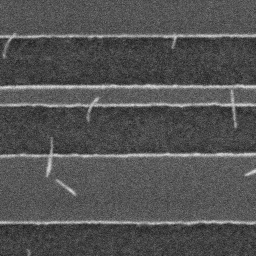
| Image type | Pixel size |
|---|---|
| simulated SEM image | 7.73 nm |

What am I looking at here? lines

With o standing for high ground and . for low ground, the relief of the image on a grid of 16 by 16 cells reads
oooooooooooooooo
oooooooooooooooo
................
................
................
oooooooooooooooo
oooooooooooooooo
................
................
................
oooooooooooooooo
oooooooooooooooo
oooooooooooooooo
oooooooooooooooo
................
................